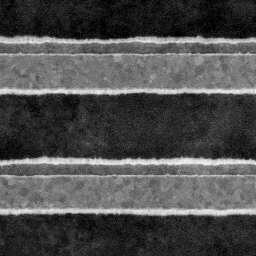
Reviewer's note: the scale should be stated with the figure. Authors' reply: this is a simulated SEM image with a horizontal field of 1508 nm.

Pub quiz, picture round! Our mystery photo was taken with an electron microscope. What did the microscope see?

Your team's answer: lines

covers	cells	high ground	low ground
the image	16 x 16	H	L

LLLLLLLLLLLLLLLL
LLLLLLLLLLLLLLLL
LLLLLLLLLLLLLLLL
HHHHHHHHHHHHHHHH
HHHHHHHHHHHHHHHH
HHHHHHHHHHHHHHHH
LLLLLLLLLLLLLLLL
LLLLLLLLLLLLLLLL
LLLLLLLLLLLLLLLL
LLLLLLLLLLLLLLLL
HHHHHHHHHHHHHHHH
HHHHHHHHHHHHHHHH
HHHHHHHHHHHHHHHH
LLLLLLLLLLLLLLLL
LLLLLLLLLLLLLLLL
LLLLLLLLLLLLLLLL